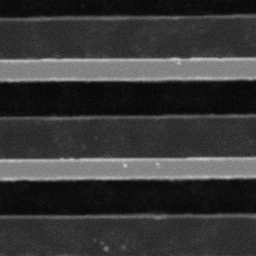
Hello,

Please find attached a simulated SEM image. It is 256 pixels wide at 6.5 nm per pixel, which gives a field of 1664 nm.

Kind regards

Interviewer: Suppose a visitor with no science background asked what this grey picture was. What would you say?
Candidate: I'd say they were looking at lines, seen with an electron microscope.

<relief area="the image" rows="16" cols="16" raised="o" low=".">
................
oooooooooooooooo
oooooooooooooooo
oooooooooooooooo
oooooooooooooooo
................
................
oooooooooooooooo
oooooooooooooooo
oooooooooooooooo
oooooooooooooooo
................
................
.........ooooooo
oooooooooooooooo
oooooooooooooooo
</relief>